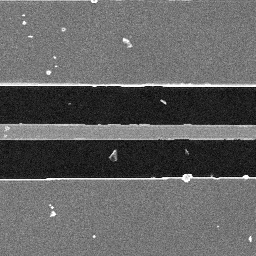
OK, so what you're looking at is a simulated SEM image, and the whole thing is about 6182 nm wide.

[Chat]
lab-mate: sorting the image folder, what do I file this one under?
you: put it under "lines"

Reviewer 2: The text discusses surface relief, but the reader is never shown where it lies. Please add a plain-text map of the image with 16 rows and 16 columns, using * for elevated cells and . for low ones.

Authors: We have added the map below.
****************
****************
****************
****************
****************
................
................
................
................
................
................
****************
****************
****************
****************
****************